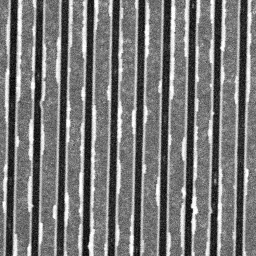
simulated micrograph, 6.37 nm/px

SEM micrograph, parallel lines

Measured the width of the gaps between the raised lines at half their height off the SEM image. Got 8.49 pixels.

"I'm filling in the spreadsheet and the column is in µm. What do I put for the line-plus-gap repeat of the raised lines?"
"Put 0.162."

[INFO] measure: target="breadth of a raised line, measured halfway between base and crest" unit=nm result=109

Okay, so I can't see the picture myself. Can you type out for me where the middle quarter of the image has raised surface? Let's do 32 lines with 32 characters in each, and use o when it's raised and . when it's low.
.oooo..oooo...oooo...ooo...oooo.
.oooo...ooo...oooo...ooo...oooo.
.oooo...ooo...oooo..oooo...oooo.
.oooo...ooo...oooo..oooo...oooo.
.oooo...ooo...oooo..oooo...oooo.
.oooo...ooo...oooo..oooo...oooo.
.oooo...ooo...oooo..oooo...oooo.
.oooo...oooo..oooo..oooo...oooo.
.oooo...oooo..oooo..oooo...oooo.
.oooo..ooooo..oooo..oooo...oooo.
.oooo..ooooo..oooo..oooo...oooo.
.oooo..oooo...oooo..oooo..ooooo.
.oooo..oooo...oooo..oooo..ooooo.
.oooo..oooo...oooo..oooo..oooo..
.oooo..oooo...oooo..oooo..oooo..
.oooo..oooo...oooo..oooo..oooo..
.oooo..oooo...oooo..oooo..oooo..
.oooo..oooo...oooo..oooo..oooo..
.oooo..oooo...oooo..oooo..oooo..
.oooo..oooo...oooo..oooo..oooo..
.oooo..oooo...oooo..oooo..oooo..
.oooo..oooo...ooo...oooo..oooo..
.oooo..oooo...ooo...oooo..oooo..
.oooo..oooo...ooo...oooo..oooo..
.oooo..oooo..oooo...oooo..oooo..
.oooo..oooo...ooo...oooo..oooo..
.oooo..oooo...ooo...oooo..oooo..
.oooo..oooo...ooo...oooo..oooo..
.oooo..oooo...ooo...oooo..oooo..
.oooo..oooo...ooo...oooo..oooo..
.oooo..oooo..oooo...oooo..oooo..
.oooo..oooo..oooo...oooo..oooo..